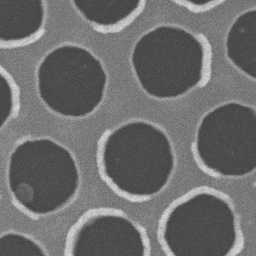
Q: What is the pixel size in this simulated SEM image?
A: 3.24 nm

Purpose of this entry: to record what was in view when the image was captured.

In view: holes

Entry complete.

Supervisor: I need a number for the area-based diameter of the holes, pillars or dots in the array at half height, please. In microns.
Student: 0.231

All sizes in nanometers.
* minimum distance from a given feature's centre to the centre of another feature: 318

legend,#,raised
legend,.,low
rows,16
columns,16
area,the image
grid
...##...########
...###.########.
#########...##..
###...##.....#..
##....##.....##.
.#.....##...####
.##...########.#
#############...
#######...##....
#...###....#....
#....##....##...
#....##...######
#...########..##
###########....#
#####....#.....#
..###....##...##